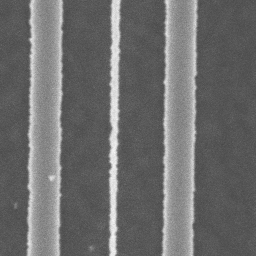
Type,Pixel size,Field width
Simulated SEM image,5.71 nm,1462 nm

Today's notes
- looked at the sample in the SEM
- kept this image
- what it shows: lines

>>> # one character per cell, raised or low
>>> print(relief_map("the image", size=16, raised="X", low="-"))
--XX------XX----
--XX------XX----
--XX------XX----
--XX------XX----
--XX------XX----
--XX------XX----
--XX------XX----
--XX------XX----
--XX------XX----
--XX------XX----
--XX------XX----
--XX------XX----
--XX------XX----
--XX------XX----
--XX------XX----
--XX------XX----